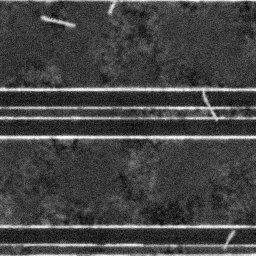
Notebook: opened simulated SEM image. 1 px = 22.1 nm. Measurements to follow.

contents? lines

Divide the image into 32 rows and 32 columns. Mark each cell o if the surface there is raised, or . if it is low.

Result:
oooooooooooooooooooooooooooooooo
oooooooooooooooooooooooooooooooo
oooooooooooooooooooooooooooooooo
oooooooooooooooooooooooooooooooo
oooooooooooooooooooooooooooooooo
oooooooooooooooooooooooooooooooo
oooooooooooooooooooooooooooooooo
oooooooooooooooooooooooooooooooo
oooooooooooooooooooooooooooooooo
oooooooooooooooooooooooooooooooo
oooooooooooooooooooooooooooooooo
................................
................................
oooooooooooooooooooooooooooooooo
oooooooooooooooooooooooooooooooo
................................
................................
oooooooooooooooooooooooooooooooo
oooooooooooooooooooooooooooooooo
oooooooooooooooooooooooooooooooo
oooooooooooooooooooooooooooooooo
oooooooooooooooooooooooooooooooo
oooooooooooooooooooooooooooooooo
oooooooooooooooooooooooooooooooo
oooooooooooooooooooooooooooooooo
oooooooooooooooooooooooooooooooo
oooooooooooooooooooooooooooooooo
oooooooooooooooooooooooooooooooo
................................
................................
................................
oooooooooooooooooooooooooooooooo